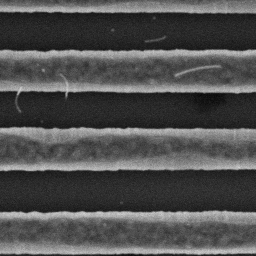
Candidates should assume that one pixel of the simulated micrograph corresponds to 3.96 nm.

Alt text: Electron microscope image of lines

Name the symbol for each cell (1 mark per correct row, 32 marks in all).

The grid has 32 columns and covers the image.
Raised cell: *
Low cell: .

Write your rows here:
********************************
................................
................................
................................
................................
................................
........**............**.****..*
********************************
********************************
********************************
********************************
................................
................................
................................
................................
................................
*****....*****************......
********************************
********************************
********************************
***********************.********
................................
................................
................................
................................
................................
................................
********************************
********************************
********************************
********************************
............***.****.*********..